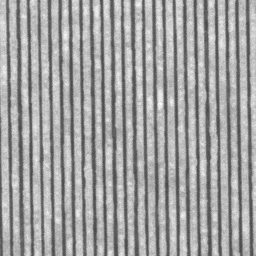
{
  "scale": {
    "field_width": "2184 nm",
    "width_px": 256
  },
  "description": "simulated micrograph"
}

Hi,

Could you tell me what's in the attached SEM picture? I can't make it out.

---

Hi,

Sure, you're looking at parallel lines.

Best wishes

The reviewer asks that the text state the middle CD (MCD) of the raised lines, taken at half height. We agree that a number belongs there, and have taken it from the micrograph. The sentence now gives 54.4 nanometres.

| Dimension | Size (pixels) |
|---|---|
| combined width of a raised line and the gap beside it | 10.4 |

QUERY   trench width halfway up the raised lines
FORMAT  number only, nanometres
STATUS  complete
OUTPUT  38.4